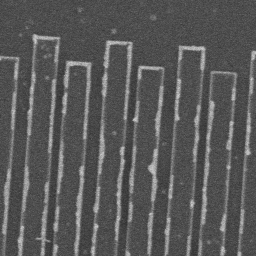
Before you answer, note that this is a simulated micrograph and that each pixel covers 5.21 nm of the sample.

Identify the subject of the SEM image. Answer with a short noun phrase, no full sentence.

parallel lines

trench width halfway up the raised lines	0.0696	um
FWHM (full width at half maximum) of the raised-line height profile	0.13	µm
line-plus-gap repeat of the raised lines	187	nm